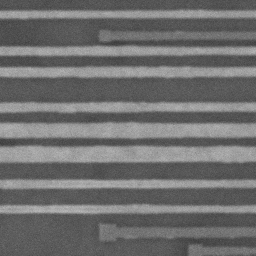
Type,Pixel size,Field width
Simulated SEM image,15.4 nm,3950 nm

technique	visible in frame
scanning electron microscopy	groups of lines, slits or small figures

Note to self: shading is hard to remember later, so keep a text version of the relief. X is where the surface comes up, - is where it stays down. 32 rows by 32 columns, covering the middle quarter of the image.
--------------------------------
XXXXXXXXXXXXXXXXXXXXXXXXXXXXXXXX
XXXXXXXXXXXXXXXXXXXXXXXXXXXXXXXX
--------------------------------
--------------------------------
--------------------------------
--------------------------------
--------------------------------
--------------------------------
--------------------------------
XXXXXXXXXXXXXXXXXXXXXXXXXXXXXXXX
XXXXXXXXXXXXXXXXXXXXXXXXXXXXXXXX
--------------------------------
--------------------------------
--------------------------------
XXXXXXXXXXXXXXXXXXXXXXXXXXXXXXXX
XXXXXXXXXXXXXXXXXXXXXXXXXXXXXXXX
XXXXXXXXXXXXXXXXXXXXXXXXXXXXXXXX
--------------------------------
--------------------------------
--------------------------------
XXXXXXXXXXXXXXXXXXXXXXXXXXXXXXXX
XXXXXXXXXXXXXXXXXXXXXXXXXXXXXXXX
XXXXXXXXXXXXXXXXXXXXXXXXXXXXXXXX
--------------------------------
--------------------------------
--------------------------------
--------------------------------
--------------------------------
XXXXXX---------XXXXXXXXXXXXXXXXX
XXXXXXXX-----XXXXXXXXXXXXXXXXXXX
--------------------------------